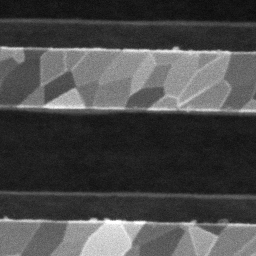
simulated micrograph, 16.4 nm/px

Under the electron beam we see lines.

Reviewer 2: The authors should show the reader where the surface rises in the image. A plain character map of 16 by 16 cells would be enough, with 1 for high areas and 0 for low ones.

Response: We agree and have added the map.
0000000000000000
1111111110000000
1111111111111111
1111111111111111
1111111111111111
1111111111111111
1111111111111111
0000000000000000
0000000000000000
0000000000000000
0000000000000000
0000000000000000
1111111111111111
1111111111111111
1111111111111111
1111111111111111